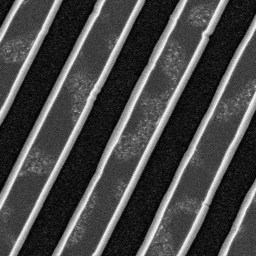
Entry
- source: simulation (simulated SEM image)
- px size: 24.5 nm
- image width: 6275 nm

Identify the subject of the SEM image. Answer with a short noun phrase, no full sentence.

one or a few lines or trenches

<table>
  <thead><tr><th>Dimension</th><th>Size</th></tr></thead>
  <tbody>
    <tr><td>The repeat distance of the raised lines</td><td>1810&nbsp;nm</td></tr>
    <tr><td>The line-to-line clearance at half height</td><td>0.879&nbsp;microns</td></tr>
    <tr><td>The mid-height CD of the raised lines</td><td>0.926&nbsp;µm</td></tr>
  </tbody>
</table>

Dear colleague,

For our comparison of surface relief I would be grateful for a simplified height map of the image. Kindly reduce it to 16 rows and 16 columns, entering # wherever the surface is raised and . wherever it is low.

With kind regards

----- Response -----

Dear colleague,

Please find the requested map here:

.##...###..###..
###...##...##...
###..###..###..#
##...##...##...#
#...###..###..##
#...##...##...##
#..###..###..###
...##...##...##.
..###..###..###.
..##...##...##..
.###..###..###..
.##...##...##...
###..###..###..#
##...##...###..#
##..###..###...#
#...##...###..##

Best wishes